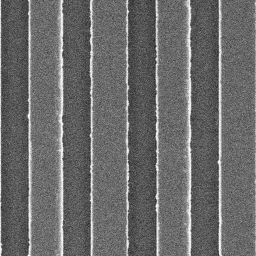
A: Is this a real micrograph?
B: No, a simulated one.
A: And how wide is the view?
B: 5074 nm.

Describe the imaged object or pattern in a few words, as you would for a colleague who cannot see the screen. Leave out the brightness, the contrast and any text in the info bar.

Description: lines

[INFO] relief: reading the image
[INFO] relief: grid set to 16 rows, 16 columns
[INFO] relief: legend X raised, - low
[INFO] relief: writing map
--XX--XX--XX--XX
--XX--XX--XX--XX
--XX--XX--XX--XX
--XX--XX--XX--XX
--XX--XX--XX--XX
--XX--XX--XX--XX
--XX--XX--XX--XX
--XX--XX--XX--XX
--XX--XX--XX--XX
--XX--XX--XX--XX
--XX--XX--XX--XX
--XX--XX--XX--XX
--XX--XX--XX--XX
--XX--XX--XX--XX
--XX--XX--XX--XX
--XX--XX--XX--XX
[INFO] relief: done